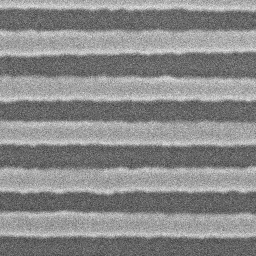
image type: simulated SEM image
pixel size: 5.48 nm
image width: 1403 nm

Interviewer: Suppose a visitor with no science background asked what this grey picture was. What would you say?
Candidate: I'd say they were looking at lines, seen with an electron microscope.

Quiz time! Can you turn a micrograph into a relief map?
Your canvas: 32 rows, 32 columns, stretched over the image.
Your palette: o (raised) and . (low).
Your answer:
oooooooooooooooooooooooooooooooo
................................
................................
................................
oooooooooooooooooooooooooooooooo
oooooooooooooooooooooooooooooooo
oooooooooooooooooooooooo....o...
................................
................................
................................
oooooooooooooooooooooooooooooooo
oooooooooooooooooooooooooooooooo
oo..............................
................................
................................
oooooooooooooooo.ooo..o.ooo.....
oooooooooooooooooooooooooooooooo
oooooooooooooooooooooooooooooooo
................................
................................
................................
oooooooooooooooooooooooooooooooo
oooooooooooooooooooooooooooooooo
oooooooooooooooooooooooooooooooo
................................
................................
................................
oooooooooooooooooooooooooooooooo
oooooooooooooooooooooooooooooooo
.....o.....o.o...oo...oooooooooo
................................
................................